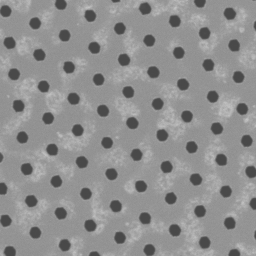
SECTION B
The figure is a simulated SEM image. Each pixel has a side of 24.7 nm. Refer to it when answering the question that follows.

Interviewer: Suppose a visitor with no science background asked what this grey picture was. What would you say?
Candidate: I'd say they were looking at a regular array of holes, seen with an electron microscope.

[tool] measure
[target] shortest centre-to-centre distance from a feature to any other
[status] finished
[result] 783 nm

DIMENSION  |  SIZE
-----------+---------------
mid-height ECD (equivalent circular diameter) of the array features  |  304 nanometres